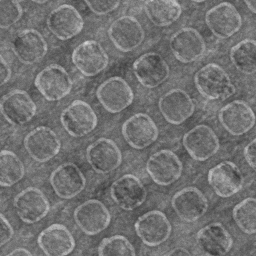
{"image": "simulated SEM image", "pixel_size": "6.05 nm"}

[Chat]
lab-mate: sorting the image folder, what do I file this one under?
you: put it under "a regular array of raised bodies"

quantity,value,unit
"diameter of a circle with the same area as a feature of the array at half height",200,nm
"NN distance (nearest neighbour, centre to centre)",264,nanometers